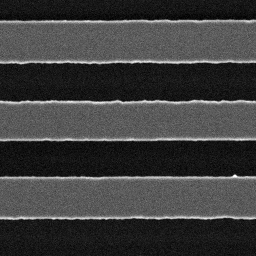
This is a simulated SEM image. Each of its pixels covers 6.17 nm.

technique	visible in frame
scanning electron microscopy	lines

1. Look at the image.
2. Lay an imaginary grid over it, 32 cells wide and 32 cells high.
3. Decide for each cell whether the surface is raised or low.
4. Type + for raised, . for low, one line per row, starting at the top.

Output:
................................
................................
................................
++++++++++++++++++++++++++++++++
++++++++++++++++++++++++++++++++
++++++++++++++++++++++++++++++++
++++++++++++++++++++++++++++++++
++++++++++++++++++++++++++++++++
................................
................................
................................
................................
................................
++++++++++++++++++++++++++++++++
++++++++++++++++++++++++++++++++
++++++++++++++++++++++++++++++++
++++++++++++++++++++++++++++++++
++++++++++++++++++++.+.+++...++.
................................
................................
................................
................................
++++++++++++++++++++++++++++++++
++++++++++++++++++++++++++++++++
++++++++++++++++++++++++++++++++
++++++++++++++++++++++++++++++++
++++++++++++++++++++++++++++++++
................................
................................
................................
................................
................................